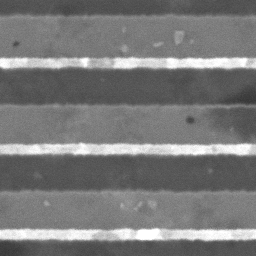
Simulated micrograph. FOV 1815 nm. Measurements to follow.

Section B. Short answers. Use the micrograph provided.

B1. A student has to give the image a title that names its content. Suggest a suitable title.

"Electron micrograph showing lines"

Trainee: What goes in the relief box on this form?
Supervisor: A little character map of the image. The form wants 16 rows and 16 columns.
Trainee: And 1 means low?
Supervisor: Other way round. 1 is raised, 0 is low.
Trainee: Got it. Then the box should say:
0000000000000000
1111111111111111
1111111111111111
1111111111111111
0000000000000000
0000000000000000
0000000000000000
1111111111111111
1111111111111111
1111111111111111
0000000000000000
0000000000000000
1111111111111111
1111111111111111
1111111111111111
0000000000000000